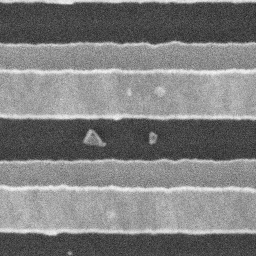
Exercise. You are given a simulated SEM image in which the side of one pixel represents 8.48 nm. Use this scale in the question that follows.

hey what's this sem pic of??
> lines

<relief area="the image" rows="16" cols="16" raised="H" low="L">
LLLLLLLLLLLLLLLL
LLLLLLLLLLLLLLLL
LLLLLLLLLLLLLLLL
HHHHHHHHHHHHHHHH
HHHHHHHHHHHHHHHH
HHHHHHHHHHHHHHHH
HHHHHHHHHHHHHHHH
LLLLLLLLLLLLLLLL
LLLLLLLLLLLLLLLL
LLLLLLLLLLLLLLLL
HHHHHHHHHHHHHHHH
HHHHHHHHHHHHHHHH
HHHHHHHHHHHHHHHH
HHHHHHHHHHHHHHHH
LHHHHLHHHHHHHHHH
LLLLLLLLLLLLLLLL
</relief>